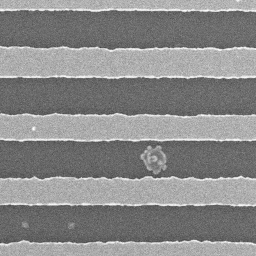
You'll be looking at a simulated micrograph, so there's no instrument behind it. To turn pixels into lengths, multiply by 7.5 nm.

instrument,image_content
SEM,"lines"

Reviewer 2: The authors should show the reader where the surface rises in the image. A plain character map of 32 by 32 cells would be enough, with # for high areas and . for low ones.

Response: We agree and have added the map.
################################
................................
................................
................................
................................
................................
################################
################################
################################
################################
................................
................................
................................
................................
################.####...###.##.#
################################
################################
.........####.......#...........
................................
..................##............
..................##............
................................
################################
################################
################################
################################
................................
................................
................................
................................
.#########.#####################
################################